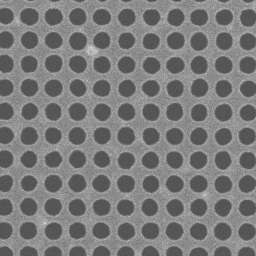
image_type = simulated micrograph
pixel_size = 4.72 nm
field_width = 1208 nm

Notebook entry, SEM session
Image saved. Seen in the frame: a regular array of holes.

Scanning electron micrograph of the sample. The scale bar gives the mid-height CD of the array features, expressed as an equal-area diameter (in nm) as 81.8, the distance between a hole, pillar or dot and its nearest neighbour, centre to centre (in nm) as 110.